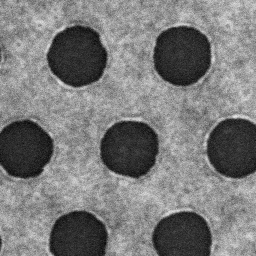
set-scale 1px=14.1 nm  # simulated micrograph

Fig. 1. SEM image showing holes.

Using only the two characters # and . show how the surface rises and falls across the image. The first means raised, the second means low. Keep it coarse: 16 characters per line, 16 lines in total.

################
################
###...####...###
###....###...###
###....###...###
####.###########
################
#.############..
...###....###...
...###....###...
...####..####...
################
################
####..####...###
###....###...###
###....###...###